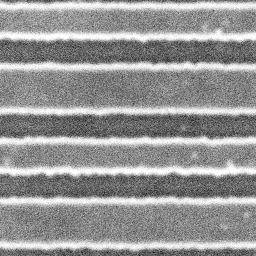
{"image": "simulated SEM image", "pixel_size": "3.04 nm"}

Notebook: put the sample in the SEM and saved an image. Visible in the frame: lines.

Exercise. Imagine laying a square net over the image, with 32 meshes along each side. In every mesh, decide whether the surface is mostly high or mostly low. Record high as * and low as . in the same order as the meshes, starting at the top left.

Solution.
........*.......................
********************************
********************************
********************************
********************************
................................
................................
................................
********************************
********************************
********************************
********************************
********************************
********************************
................................
................................
................................
**.*********..**.***.*****..**.*
********************************
********************************
********************************
.****.*..******.*****.**.*****.*
................................
................................
................................
********************************
********************************
********************************
********************************
********************************
********************************
................................